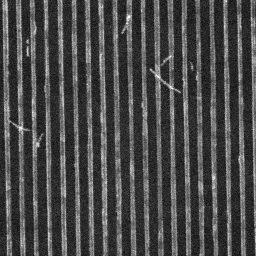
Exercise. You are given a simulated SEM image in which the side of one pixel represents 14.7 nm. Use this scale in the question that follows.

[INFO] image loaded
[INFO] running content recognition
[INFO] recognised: parallel lines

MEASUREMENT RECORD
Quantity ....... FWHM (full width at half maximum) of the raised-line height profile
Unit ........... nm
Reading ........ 57.1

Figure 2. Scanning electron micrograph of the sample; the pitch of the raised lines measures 203 nanometers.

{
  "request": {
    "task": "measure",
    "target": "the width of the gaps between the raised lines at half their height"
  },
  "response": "146 nm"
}